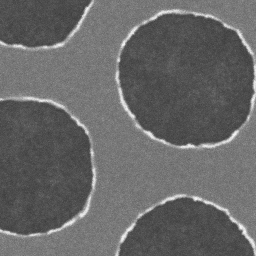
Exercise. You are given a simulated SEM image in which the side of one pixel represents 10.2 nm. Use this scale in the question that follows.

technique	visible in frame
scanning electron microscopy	holes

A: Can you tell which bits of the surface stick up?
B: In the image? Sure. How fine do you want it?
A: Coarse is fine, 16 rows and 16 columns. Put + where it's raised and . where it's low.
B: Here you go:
.....+++++++++++
.....++++.....++
....++++.......+
++++++++........
+++++++.........
++++++++........
...+++++........
.....++++......+
.....+++++....++
......++++++++++
......++++++++++
......++++++++++
.....++++++.++++
.....++++.....++
+..+++++.......+
++++++++........